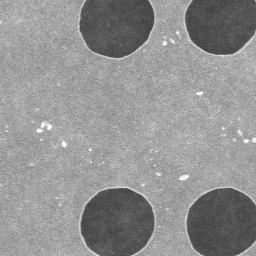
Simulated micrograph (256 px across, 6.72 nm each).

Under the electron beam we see holes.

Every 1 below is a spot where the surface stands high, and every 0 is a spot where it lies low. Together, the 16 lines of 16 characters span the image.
1111100000110000
1111100000110000
1111100001110000
1111111011111111
1111111111111111
1111111111111111
1111111111111111
1111111111111111
1111111111111111
1111111111111111
1111111111111111
1111111111111111
1111110001110000
1111100000110000
1111100000110000
1111110001110001